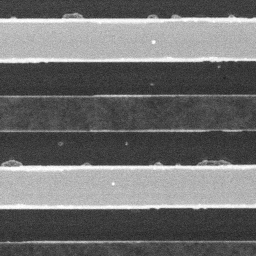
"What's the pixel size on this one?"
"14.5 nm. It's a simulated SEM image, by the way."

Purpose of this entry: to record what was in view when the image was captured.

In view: lines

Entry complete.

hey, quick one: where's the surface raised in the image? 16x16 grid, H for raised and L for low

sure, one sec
LLLLLLLLLLLLLLLL
HHHHHHHHHHHHHHHH
HHHHHHHHHHHHHHHH
HHHHHHHHHHHHHHHH
LLLLLLLLLLLLLLLL
LLLLLLLLLLLLLLLL
HHHHHHHHHHHHHHHH
HHHHHHHHHHHHHHHH
LLLLLLLLLLLLLLLL
LLLLLLLLLLLLLLLL
HHHHHHHHHHHHHHHH
HHHHHHHHHHHHHHHH
HHHHHHHHHHHHHHHH
LLLLLLLLLLLLLLLL
LLLLLLLLLLLLLLLL
HHHHHHHHHHHHHHHH